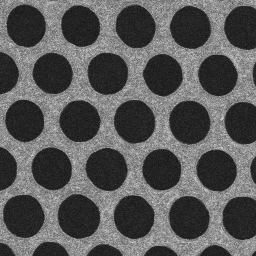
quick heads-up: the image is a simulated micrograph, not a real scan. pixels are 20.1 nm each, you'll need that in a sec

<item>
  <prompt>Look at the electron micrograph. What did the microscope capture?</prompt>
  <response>a regular array of holes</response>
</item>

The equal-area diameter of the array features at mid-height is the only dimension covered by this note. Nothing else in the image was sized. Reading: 831 nm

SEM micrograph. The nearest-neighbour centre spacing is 1.1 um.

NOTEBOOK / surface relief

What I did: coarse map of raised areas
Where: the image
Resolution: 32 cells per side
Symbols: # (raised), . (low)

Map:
################################
#....###....###....###....###...
#.....##....###....##.....##....
#.....##.....#.....##.....##....
#....###....###....###....##....
##...####..#####...###...####...
################################
..###...###.....###...####...###
..##.....##.....##.....##....###
..##.....##.....##.....##.....##
..###....##.....##.....##....###
.#####..####...####...####...###
################################
#....###....###....###....###...
#....###....##.....##.....##....
#.....#......#.....##.....##....
#....###....###....##.....##....
##..#####..#####..####...####...
######.#########################
..##....###....###....###....###
..##.....##.....##.....##....##.
..##.....##.....##.....##.....#.
..##.....##.....##....###....###
.#####..####...####..#####..####
##..#####..#####.######.########
#....###....###....###...###....
.....##.....##.....##.....##....
......#.....##.....##.....##....
#....###....###....##.....##....
##..#####..#####..####...####...
.####..#########################
..##....###....###....###....###